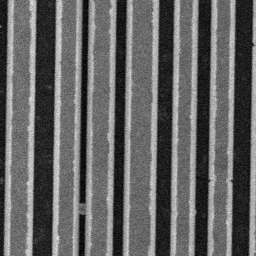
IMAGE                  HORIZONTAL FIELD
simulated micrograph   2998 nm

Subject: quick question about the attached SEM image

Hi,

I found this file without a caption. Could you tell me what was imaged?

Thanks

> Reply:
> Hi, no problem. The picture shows parallel lines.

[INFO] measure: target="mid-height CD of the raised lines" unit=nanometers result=254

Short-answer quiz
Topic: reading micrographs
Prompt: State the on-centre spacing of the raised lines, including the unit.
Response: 471 nm